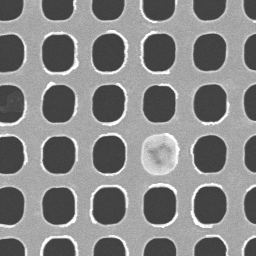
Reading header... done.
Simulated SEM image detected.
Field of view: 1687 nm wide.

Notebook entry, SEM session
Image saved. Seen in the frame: a regular array of holes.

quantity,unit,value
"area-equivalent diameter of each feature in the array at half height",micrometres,0.239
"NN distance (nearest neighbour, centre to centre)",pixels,50.2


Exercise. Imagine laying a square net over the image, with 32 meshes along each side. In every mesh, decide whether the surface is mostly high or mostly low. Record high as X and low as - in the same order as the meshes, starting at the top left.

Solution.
---XX----XX-----XX----XX----XX--
---XX----XXX---XXX----XX----XXX-
-XXXXXX-XXXXX-XXXXX-XXXXX-XXXXXX
XXXXXXXXXXXXXXXXXXXXXXXXXXXXXXXX
--XXXX---XXXX--XXXX--XXXX--XXXX-
---XX----XXX---XXX----XX----XXX-
---XX----XX-----XX----XX----XX--
---XX----XXX---XXX----XX----XXX-
--XXXX---XXX---XXX---XXXX--XXXX-
XXXXXXXXXXXXXXXXXXXXXXXXXXXXXXXX
XXXXXXXXXXXXXXXXXXXXXXXXXXXXXXXX
---XXX---XXX---XXX----XXX---XXX-
---XX----XXX----XX----XX----XX--
---XX----XX----XXX----XX----XX--
---XX----XXX---XXX----XX----XXX-
XXXXXXXXXXXXXXXXXXXXXXXXXXXXXXXX
XXXXXXXXXXXXXXXXXXXXXXXXXXXXXXXX
---XXX---XXX---XXXXXXXXXX---XXX-
---XX----XXX----XXXXXXXX----XXX-
---XX----XXX----XXXXXXXX----XXX-
---XX----XXX----XXXXXXXX----XXX-
--XXXX--XXXXX--XXXXXXXXXX--XXXXX
XXXXXXXXXXXXXXXXXXXXXXXXXXXXXXXX
X-XXXXX-XXXXX--XXXX--XXXX--XXXXX
---XXX---XXX----XX----XX----XXX-
---XX----XXX----XX----XX----XXX-
---XX----XXX----XX----XX----XXX-
--XXXX---XXX---XXX---XXXX---XXX-
XXXXXXXXXXXXXXXXXXXXXXXXXXXXXXXX
XXXXXXXXXXXXXXXXXXXXXXXXXXXXXXXX
---XXX---XXX---XXX----XXX---XXX-
---XX----XXX----XX----XX----XXX-